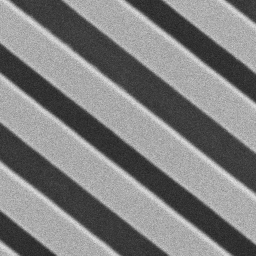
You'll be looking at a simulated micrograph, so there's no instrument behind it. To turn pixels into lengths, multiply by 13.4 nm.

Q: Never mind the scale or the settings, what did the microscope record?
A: lines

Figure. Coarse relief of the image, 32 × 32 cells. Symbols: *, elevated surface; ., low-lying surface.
**......********.....********...
***.......********....********..
****.......********....********.
******......********.....*******
*******......********.....******
********.......********....*****
.********.......********.....***
...********......********.....**
....********......********.....*
*....********.......********....
**....********.......********...
***.....********......********..
****.....********.......*******.
******....********.......*******
*******.....********......******
********.....********......*****
..*******.....********.......***
...********....********.......**
....********.....********......*
.....********.....********......
.......*******.....********.....
**......********.....*******....
***......********.....********..
****......********.....********.
******......********....********
*******......********.....******
********......********.....*****
..*******.......*******.....****
...********......********....***
....********......********.....*
*....********......********.....
**.....*******.......*******....